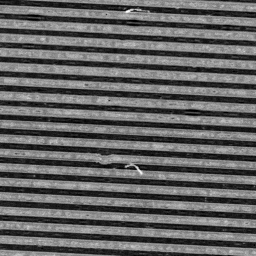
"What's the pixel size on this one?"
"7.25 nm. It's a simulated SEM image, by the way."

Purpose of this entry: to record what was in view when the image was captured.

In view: parallel lines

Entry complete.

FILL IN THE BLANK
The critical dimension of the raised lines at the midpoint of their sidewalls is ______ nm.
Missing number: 56.1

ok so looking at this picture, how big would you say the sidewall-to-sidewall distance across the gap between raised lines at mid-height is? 48.8 nanometres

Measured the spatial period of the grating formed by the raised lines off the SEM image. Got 0.104 microns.